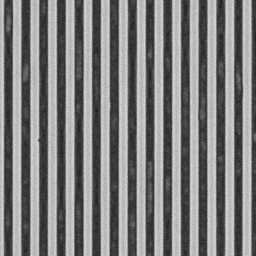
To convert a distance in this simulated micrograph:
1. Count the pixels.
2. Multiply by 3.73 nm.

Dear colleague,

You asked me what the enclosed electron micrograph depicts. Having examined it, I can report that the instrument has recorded parallel lines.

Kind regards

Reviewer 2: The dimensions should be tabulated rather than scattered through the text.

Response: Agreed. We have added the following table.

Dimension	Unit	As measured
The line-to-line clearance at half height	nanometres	35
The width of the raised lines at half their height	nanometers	32.2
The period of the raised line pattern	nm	66.1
